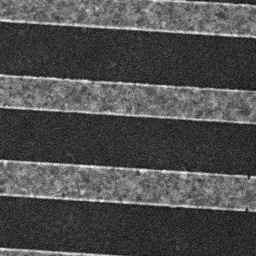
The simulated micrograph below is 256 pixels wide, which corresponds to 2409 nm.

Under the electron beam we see one or a few lines or trenches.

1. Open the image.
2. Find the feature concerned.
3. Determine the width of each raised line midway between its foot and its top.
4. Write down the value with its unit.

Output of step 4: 301 nanometres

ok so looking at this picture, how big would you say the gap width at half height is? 510 nm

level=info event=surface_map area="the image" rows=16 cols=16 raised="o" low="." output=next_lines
oooooooooooooooo
...ooooooooooooo
................
................
................
oooooooooooo....
oooooooooooooooo
.............ooo
................
................
ooooooo.........
oooooooooooooooo
.....ooooooooooo
................
................
................